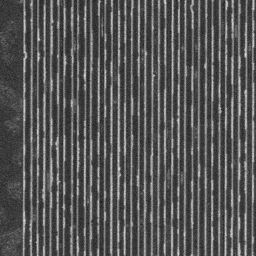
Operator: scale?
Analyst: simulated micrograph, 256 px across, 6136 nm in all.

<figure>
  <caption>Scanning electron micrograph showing parallel lines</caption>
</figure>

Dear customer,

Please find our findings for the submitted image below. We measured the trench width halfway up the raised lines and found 144 nanometres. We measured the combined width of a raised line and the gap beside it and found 322 nm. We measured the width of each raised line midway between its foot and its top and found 0.183 micrometres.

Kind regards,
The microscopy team